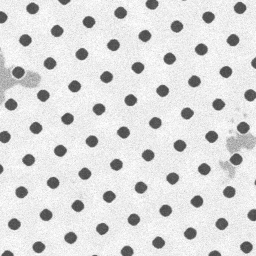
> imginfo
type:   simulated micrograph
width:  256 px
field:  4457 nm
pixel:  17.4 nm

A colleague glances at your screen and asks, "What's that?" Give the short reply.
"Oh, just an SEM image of a regular array of holes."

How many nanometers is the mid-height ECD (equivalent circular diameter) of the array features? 218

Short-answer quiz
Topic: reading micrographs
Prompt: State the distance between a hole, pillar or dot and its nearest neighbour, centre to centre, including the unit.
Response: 570 nm